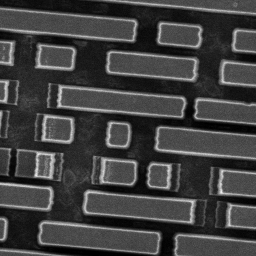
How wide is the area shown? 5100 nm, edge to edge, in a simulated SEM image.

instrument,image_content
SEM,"parallel lines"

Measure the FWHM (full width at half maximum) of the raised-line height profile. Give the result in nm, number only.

459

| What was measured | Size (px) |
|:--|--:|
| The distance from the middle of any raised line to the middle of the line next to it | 34.7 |